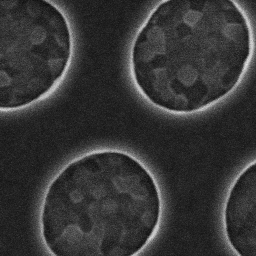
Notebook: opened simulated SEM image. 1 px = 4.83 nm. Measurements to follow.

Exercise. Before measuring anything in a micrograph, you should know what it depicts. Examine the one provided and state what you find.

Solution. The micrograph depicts holes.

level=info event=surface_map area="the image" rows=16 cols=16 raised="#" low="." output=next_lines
...#######.....#
....#####......#
....#####.......
....####.......#
....####.......#
...######......#
..########...###
################
################
######.#########
####.....#######
###.......#####.
###.......####..
###.......####..
###.......####..
###......######.